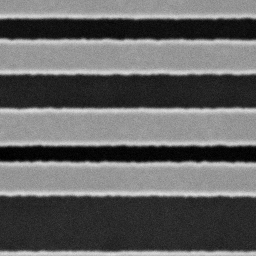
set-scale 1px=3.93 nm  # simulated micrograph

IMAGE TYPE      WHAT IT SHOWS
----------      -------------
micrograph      lines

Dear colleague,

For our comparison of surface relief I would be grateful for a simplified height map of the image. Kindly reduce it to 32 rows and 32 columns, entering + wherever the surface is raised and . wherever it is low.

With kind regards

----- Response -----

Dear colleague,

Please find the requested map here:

++++++++++++++++++++++++++++++++
++++++++++++++++++++++++++++++++
................................
................................
................................
++++++++++++++++++++++++++++++++
++++++++++++++++++++++++++++++++
++++++++++++++++++++++++++++++++
++++++++++++++++++++++++++++++++
................................
................................
................................
................................
................................
++++++++++++++++++++++++++++++++
++++++++++++++++++++++++++++++++
++++++++++++++++++++++++++++++++
++++++++++++++++++++++++++++++++
................................
................................
++++++++++++++++++++++++++++++++
++++++++++++++++++++++++++++++++
++++++++++++++++++++++++++++++++
++++++++++++++++++++++++++++++++
........................+.+....+
................................
................................
................................
................................
................................
................................
+++++++++++++..++.+++++++++++.++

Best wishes